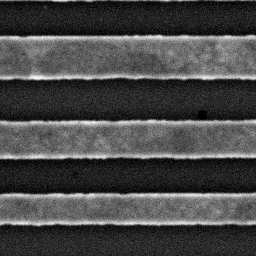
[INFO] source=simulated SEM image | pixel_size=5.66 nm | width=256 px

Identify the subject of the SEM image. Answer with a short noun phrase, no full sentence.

lines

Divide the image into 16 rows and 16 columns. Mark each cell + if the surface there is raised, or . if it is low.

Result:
................
................
++++++++++++++++
++++++++++++++++
++++++++++++++++
................
................
................
++++++++++++++++
++++++++++++++++
................
................
++++++++++++++++
++++++++++++++++
................
................